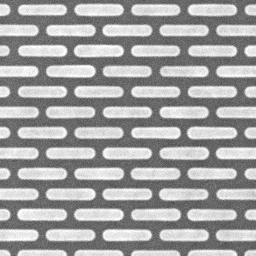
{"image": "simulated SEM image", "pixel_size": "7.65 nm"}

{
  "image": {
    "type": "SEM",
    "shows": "groups of lines, slits or small figures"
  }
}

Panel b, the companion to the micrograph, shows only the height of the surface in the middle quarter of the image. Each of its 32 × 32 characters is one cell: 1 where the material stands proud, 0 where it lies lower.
11111110000000000000000000000000
11111111001111111111110011111111
11111111001111111111110011111111
00000000000000000000000000000000
00000000000000000000000000000000
00000000000000000000000000000000
10011111111111100111111111111001
10011111111111100111111111111001
00000000000000000000000000000000
00000000000000000000000000000000
00000000000000000000000000000000
11111110001111111111110011111111
11111111001111111111110011111111
00000000000000000000000000000000
00000000000000000000000000000000
00000000000000000000000000000000
00011111111111100111111111111001
10011111111111100111111111111001
00001111111111000000000111110001
00000000000000000000000000000000
00000000000000000000000000000000
11111110001111111111100011111111
11111111001111111111110011111111
11111110001111111111100001111111
00000000000000000000000000000000
00000000000000000000000000000000
00011111111111000111111111110001
10011111111111100111111111111001
00011111111111000111111111110001
00000000000000000000000000000000
00000000000000000000000000000000
11111110001111111111100001111111